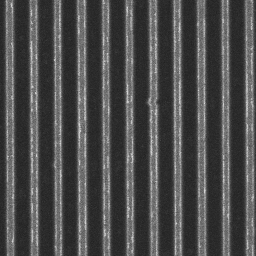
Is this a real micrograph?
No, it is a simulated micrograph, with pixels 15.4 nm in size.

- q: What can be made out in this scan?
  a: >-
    parallel lines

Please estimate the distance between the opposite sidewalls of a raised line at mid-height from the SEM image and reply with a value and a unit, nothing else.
160 nanometres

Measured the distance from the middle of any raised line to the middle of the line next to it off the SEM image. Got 0.368 um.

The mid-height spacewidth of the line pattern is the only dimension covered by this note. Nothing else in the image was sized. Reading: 0.217 um